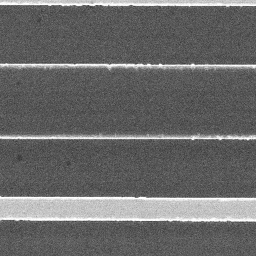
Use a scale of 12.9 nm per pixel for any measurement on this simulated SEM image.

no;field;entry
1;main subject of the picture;lines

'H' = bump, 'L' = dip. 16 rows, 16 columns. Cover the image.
LLLLLLLLLLLLLLLL
LLLLLLLLLLLLLLLL
LLLLLLLLLLLLLLLL
LLLLLLLLLLLLLLLL
HHHHHHHHHHHHHHHH
HHHHHHHHHHHHHHHH
HHHHHHHHHHHHHHHH
HHHHHHHHHHHHHHHH
HHHHHHHHHHHHHHHH
LLLLLLLLLLLLLLLL
LLLLLLLLLLLLLLLL
LLLLLLLLLLLLLLLL
HHHHHHHHHHHHHHHH
HHHHHHHHHHHHHHHH
LLLLLLLLLLLLLLLL
LLLLLLLLLLLLLLLL